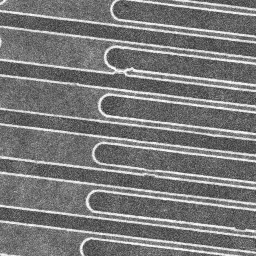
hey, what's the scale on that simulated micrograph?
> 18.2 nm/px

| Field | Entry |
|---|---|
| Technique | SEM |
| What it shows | parallel lines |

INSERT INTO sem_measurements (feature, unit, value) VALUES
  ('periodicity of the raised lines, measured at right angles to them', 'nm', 437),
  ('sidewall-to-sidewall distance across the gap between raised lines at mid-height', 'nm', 284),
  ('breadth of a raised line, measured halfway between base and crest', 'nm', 110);